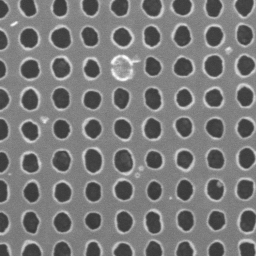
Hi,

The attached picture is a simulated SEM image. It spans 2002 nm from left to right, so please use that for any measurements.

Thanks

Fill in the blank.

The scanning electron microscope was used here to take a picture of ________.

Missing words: a regular array of holes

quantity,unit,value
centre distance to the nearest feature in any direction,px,30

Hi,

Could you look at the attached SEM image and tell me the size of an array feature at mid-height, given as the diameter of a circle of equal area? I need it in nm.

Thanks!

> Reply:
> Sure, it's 148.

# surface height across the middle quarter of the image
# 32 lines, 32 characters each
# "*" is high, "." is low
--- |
..***....***********....***.....
..***....***********....***.....
.****....************...****...*
********************************
********************************
********************************
.************..******..******..*
.****....***....****....****....
.****....***....****....****....
.****....***....****....****....
.****....****...*****...*****..*
********************************
********************************
*****************************..*
.*****...****...****....****....
.****....***.....***....****....
..***....***.....***....****....
.****....****....***....*****...
*******.******..*****..*********
********************************
********************************
******..******..*************.**
.****....****....****...****....
..***.....**.....***.....***....
..***.....**.....****....***....
.****....****....****...*****...
.*****...****....***************
********************************
********************************
*************...******.******..*
.*****...****....****...****....
..***....****....****...****....